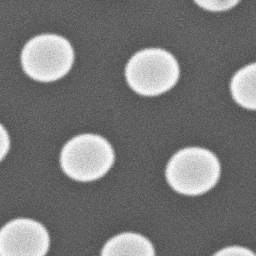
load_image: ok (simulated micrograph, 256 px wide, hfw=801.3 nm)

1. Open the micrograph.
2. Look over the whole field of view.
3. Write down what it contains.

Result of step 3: raised bodies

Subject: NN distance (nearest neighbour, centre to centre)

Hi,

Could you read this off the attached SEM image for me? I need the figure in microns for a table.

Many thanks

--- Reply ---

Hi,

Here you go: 0.333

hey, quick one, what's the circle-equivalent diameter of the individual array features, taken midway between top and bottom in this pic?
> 152 nanometres